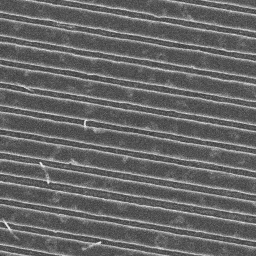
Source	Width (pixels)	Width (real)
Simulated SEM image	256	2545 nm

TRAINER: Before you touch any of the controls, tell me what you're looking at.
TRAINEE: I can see parallel lines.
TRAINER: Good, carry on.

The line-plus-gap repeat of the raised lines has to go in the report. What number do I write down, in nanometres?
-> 228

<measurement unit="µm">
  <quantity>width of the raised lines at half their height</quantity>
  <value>0.172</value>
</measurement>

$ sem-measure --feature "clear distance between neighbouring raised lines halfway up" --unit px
5.54